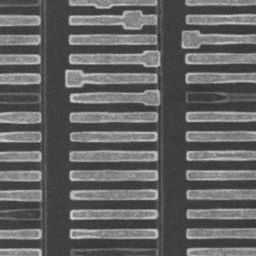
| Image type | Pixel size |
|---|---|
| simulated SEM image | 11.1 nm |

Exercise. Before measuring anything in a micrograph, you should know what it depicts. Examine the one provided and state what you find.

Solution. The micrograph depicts wiring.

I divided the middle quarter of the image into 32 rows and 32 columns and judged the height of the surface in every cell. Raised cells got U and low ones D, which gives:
DDDDDDDDDDDDDDDDDDDDDDDDDDDDDDDD
DDDDDDDDDDDDDDDDDDDDDDDDDDDDDDDD
DUUUUDDDDUUUDDDDDDDDDDDDDDDDDDDU
DUUUUUUUUUUUUUUUUUUUUUUDDDDDDDDU
DUUUUDUUUUUUUUUUUUUUUUUDDDDDDDDU
DDDDDDDDDDDDDDDDDDDDDDDDDDDDDDDD
DDDDDDDDDDDDDDDDDDDDDDDDDDDDDDDD
DDDDDDDUUUUUUUUUDDDUUUUUDDDDDDDU
DDUUUUUUUUUUUUUUUUUUUUUUDDDDDDDU
DDDDDDUUUUDDDDDDDDDDUUUUDDDDDDDD
DDDDDDDDDDDDDDDDDDDDDDDDDDDDDDDD
DDDDDDDDDDDDDDDDDDDDDDDDDDDDDDDD
DDUUUUUUUUUUUUUUUUUUUUUDDDDDDDDU
DDUUUUUUUUUUUUUUUUUUUUUDDDDDDDDU
DDDDDUUUDDDDDDDDDDDDDDDDDDDDDDDD
DDDDDDDDDDDDDDDDDDDDDDDDDDDDDDDD
DDDDDDDDDDDDDDDDDDDDDDDDDDDDDDDD
DDUUUUUUUUUUUUUUUUUUUUUDDDDDDDDU
DDUUUUUUUUUUUUUUUUUUUUUDDDDDDDDU
DDDDDDDDDDDDDDDDDDDDDDDDDDDDDDDD
DDDDDDDDDDDDDDDDDDDDDDDDDDDDDDDD
DDDDDDDDDDDDDDDDDDDDDDDDDDDDDDDD
DDUUUUUUUUUUUUUUUUUUUUUDDDDDDDDU
DDUUUUUUUUUUUUUUUUUUUUUDDDDDDDDU
DDDDDDDDDDDDDDDDDDDDDDDDDDDDDDDD
DDDDDDDDDDDDDDDDDDDDDDDDDDDDDDDD
DDDDDDDDDDDDDDDDDDDDDDDDDDDDDDDD
DDUUUUUUUUUUUUUUUUUUUUUDDDDDDDDU
DDUUUUUUUUUUUUUUUUUUUUUDDDDDDDDU
DDDDDDDDDDDDDDDDDDDDDDDDDDDDDDDD
DDDDDDDDDDDDDDDDDDDDDDDDDDDDDDDD
DDDDDDDDDDDDDDDDDDDDDDDDDDDDDDDD